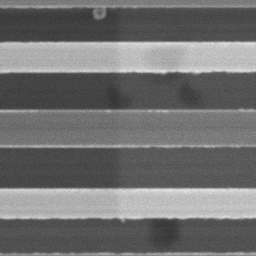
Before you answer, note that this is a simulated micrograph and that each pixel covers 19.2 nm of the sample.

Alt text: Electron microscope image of lines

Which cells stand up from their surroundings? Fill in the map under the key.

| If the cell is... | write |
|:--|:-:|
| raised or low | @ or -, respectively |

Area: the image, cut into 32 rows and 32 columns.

@@@@@@@@@@@@@@@@@@@@@@@@@@@@@@@@
--------------------------------
--------------------------------
--------------------------------
--------------------------------
@@@@@@@@@@@@@@@@@@@@@@@@@@@@@@@@
@@@@@@@@@@@@@@@@@@@@@@@@@@@@@@@@
@@@@@@@@@@@@@@@@@@@@@@@@@@@@@@@@
@@@@@@@@@@@@@@@@@@@@@@@@@@@@@@@@
--------------------------------
--------------------------------
--------------------------------
--------------------------------
--------------------------------
@@@@@@@@@@@@@@@@@@@@@@@@@@@@@@@@
@@@@@@@@@@@@@@@@@@@@@@@@@@@@@@@@
@@@@@@@@@@@@@@@@@@@@@@@@@@@@@@@@
@@@@@@@@@@@@@@@@@@@@@@@@@@@@@@@@
--------------------------------
--------------------------------
--------------------------------
--------------------------------
--------------------------------
--------------------------------
@@@@@@@@@@@@@@@@@@@@@@@@@@@@@@@@
@@@@@@@@@@@@@@@@@@@@@@@@@@@@@@@@
@@@@@@@@@@@@@@@@@@@@@@@@@@@@@@@@
--------------------------------
--------------------------------
--------------------------------
--------------------------------
--------------------------------